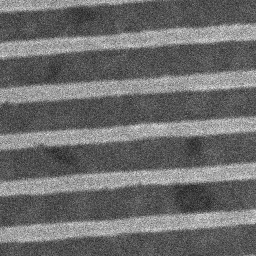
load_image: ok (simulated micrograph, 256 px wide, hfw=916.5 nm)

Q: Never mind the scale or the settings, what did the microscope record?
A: parallel lines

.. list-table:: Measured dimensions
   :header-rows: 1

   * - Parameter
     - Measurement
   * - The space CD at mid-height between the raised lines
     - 0.117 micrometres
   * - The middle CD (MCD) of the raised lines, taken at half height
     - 13.4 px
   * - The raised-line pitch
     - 0.166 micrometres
